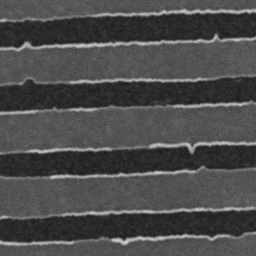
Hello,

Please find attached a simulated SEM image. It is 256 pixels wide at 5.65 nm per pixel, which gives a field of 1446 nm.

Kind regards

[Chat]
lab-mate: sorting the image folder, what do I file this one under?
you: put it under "one or a few lines or trenches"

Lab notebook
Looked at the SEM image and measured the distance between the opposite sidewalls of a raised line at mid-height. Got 0.231 µm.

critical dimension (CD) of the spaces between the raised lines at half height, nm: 141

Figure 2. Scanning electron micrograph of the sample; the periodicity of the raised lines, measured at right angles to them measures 372 nanometres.